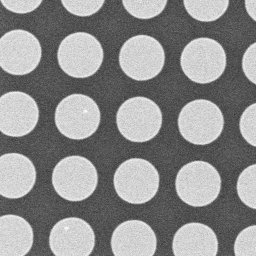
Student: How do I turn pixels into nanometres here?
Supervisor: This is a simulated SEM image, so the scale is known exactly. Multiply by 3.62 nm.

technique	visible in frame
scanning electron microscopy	an array of small figures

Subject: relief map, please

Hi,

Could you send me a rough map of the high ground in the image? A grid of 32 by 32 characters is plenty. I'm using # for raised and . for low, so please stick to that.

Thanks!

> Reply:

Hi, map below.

#####...#####..######..#####...#
..#......###....####....####...#
.........................##.....
................................
####.....##......#..............
#####...####....####....###.....
#####..######..#####...#####...#
#####..######..#####...#####..##
####....####...#####...#####..##
.........##.....###....####....#
................................
.#..............................
####....####....###.............
#####..#####...#####...####....#
#####..#####...#####..######..##
####...#####...#####..######..##
####....####...#####...#####..##
................##.....####....#
................................
###.............................
####...####....####....###......
####...#####...#####..#####...##
####...#####..######..#####...##
####...#####..######..#####...##
###.....###....####...#####...##
.......................###.....#
................................
###.....##......................
####...####....####....###.....#
####..######..#####...#####...##
####..######..#####...#####..###
###....####...#####...#####..###